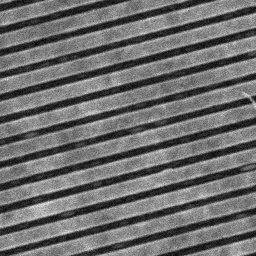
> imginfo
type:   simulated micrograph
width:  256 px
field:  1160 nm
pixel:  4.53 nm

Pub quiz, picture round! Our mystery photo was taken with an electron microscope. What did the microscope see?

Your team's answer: parallel lines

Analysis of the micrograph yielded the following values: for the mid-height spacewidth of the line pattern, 0.0383 micrometres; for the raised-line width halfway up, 0.0608 µm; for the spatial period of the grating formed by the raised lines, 98.4 nm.